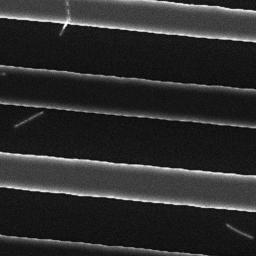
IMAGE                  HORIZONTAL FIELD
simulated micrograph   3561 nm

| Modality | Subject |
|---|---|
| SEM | lines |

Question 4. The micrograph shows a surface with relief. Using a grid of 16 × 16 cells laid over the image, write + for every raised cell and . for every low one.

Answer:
++++++++++++++..
....++++++++++++
..............++
................
++++............
+++++++++++++++.
++++++++++++++++
...........+++++
................
................
++++++++++......
++++++++++++++++
........++++++++
................
................
+++++++++.......